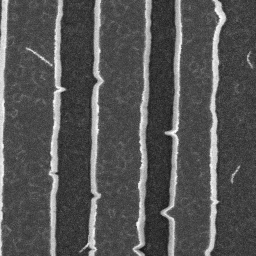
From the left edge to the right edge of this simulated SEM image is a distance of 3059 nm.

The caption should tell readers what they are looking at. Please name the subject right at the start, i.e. one or a few lines or trenches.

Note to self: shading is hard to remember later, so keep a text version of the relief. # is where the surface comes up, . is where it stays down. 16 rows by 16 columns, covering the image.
####..###..###..
####..###..###..
####..###..###..
####..###..##...
####..###..##...
####..###..##...
####..###..##...
####..###..##...
###...###..##...
###...###..##...
###...###..##...
###...###..##...
###...###..##...
###...###.###...
###...###..##...
###...###..##...